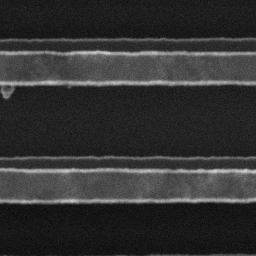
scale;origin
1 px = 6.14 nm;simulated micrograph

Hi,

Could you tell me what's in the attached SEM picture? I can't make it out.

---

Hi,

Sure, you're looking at lines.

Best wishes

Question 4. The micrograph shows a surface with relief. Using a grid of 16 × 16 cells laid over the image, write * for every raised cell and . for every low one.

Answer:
................
................
................
****************
****************
................
................
................
................
................
................
****************
****************
................
................
................